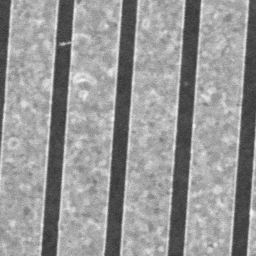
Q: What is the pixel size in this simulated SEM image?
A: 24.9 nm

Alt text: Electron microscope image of one or a few lines or trenches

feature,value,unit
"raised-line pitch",63.2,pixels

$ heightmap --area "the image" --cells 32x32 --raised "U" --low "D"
DUUUUUUDDUUUUUUDDUUUUUUDDUUUUUUD
DUUUUUUDDUUUUUUDDUUUUUUDDUUUUUUD
DUUUUUUDDUUUUUUDDUUUUUUDDUUUUUUD
DUUUUUUDDUUUUUUDDUUUUUUDDUUUUUUD
DUUUUUUDDUUUUUUDDUUUUUUDDUUUUUUD
DUUUUUUDDUUUUUUDDUUUUUUDDUUUUUUD
DUUUUUUDDUUUUUUDDUUUUUUDDUUUUUUD
DUUUUUUDDUUUUUUDDUUUUUUDDUUUUUDD
DUUUUUUDDUUUUUUDDUUUUUDDDUUUUUDD
DUUUUUUDDUUUUUDDDUUUUUDDDUUUUUDD
DUUUUUDDDUUUUUDDDUUUUUDDDUUUUUDD
DUUUUUDDDUUUUUDDDUUUUUDDUUUUUUDD
DUUUUUDDDUUUUUDDUUUUUUDDUUUUUUDD
DUUUUUDDDUUUUUDDUUUUUUDDUUUUUUDD
DUUUUUDDUUUUUUDDUUUUUUDDUUUUUUDD
UUUUUUDDUUUUUUDDUUUUUUDDUUUUUUDD
UUUUUUDDUUUUUUDDUUUUUUDDUUUUUUDD
UUUUUUDDUUUUUUDDUUUUUUDDUUUUUUDD
UUUUUUDDUUUUUUDDUUUUUUDDUUUUUUDD
UUUUUUDDUUUUUUDDUUUUUUDDUUUUUUDD
UUUUUUDDUUUUUUDDUUUUUUDDUUUUUUDD
UUUUUUDDUUUUUUDDUUUUUUDDUUUUUDDD
UUUUUUDDUUUUUUDDUUUUUDDDUUUUUDDD
UUUUUUDDUUUUUUDDUUUUUDDDUUUUUDDD
UUUUUDDDUUUUUDDDUUUUUDDDUUUUUDDD
UUUUUDDDUUUUUDDDUUUUUDDDUUUUUDDU
UUUUUDDDUUUUUDDDUUUUUDDUUUUUUDDU
UUUUUDDUUUUUUDDUUUUUUDDUUUUUUDDU
UUUUUDDUUUUUUDDUUUUUUDDUUUUUUDDU
UUUUUDDUUUUUUDDUUUUUUDDUUUUUUDDU
UUUUUDDUUUUUUDDUUUUUUDDUUUUUUDDU
UUUUUDDUUUUUUDDUUUUUUDDUUUUUUDDU